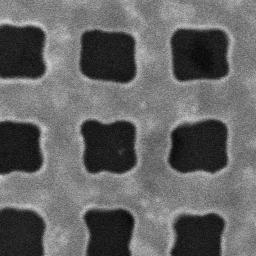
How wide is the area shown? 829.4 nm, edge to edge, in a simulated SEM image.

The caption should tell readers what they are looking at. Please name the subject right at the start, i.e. holes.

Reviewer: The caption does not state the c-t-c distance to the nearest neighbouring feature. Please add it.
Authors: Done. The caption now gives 0.292 microns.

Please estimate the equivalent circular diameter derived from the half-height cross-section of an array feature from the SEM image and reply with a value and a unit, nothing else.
0.193 micrometres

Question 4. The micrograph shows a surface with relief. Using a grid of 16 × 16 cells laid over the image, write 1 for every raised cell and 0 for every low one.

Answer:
1111111111111111
0111111111111111
0001100011100011
0001100011100011
0001100001100011
1111111111111111
1111111111111111
1111111111110011
0011100001100011
0001100001100011
0011100011100011
1111111111111111
1111111111111111
0011100011100011
0001100011100011
0001100011100011